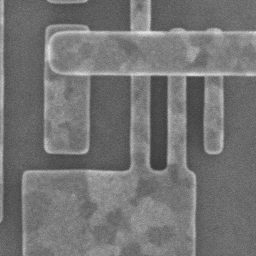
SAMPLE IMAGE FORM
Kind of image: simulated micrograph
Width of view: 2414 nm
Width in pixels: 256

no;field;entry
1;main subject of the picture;wiring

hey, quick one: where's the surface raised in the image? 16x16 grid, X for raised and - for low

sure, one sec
----------------
----------------
---XXXXXXXXXXXXX
---XXXXXXXXXXXXX
----XXXXXXXXXXXX
----------------
----------------
----------------
----------------
----------------
----------------
----------------
----------------
----------------
----------------
----------------